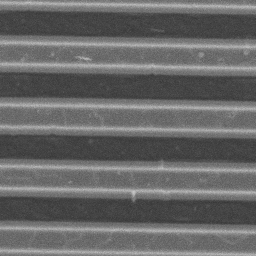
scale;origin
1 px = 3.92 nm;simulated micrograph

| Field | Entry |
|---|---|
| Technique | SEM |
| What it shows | parallel lines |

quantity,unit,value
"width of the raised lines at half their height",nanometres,112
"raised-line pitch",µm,0.243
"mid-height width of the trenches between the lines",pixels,33.5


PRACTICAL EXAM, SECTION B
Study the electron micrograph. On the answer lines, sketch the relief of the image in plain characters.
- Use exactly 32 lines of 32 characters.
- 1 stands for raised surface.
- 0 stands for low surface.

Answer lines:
11111111111111111111111111111111
00000000000000000000000000000000
00000000000000000000000000000000
00000000000000000000000000000000
00000000000000000000000000000000
11111111111111111111111111111110
11111111111111111111111111111111
11111111111111111111111111111111
00000100001111111111111111111111
00000000000000000000000000000000
00000000000000000000000000000000
00000000000000000000000000000000
00000000000000000000000000000000
11111111111111111111111111111111
11111111111111111111111111111111
11111111111111111111111111111111
00000000000000000001111111111111
00000000000000000000000000000000
00000000000000000000000000000000
00000000000000000000000000000000
11000000000000000000000000000000
11111111111111111111111111111111
11111111111111111111111111111111
11111111111111111111111111111111
00000000000000000000000000000000
00000000000000000000000000000000
00000000000000000000000000000000
00000000000000000000000000000000
11111111111111111111111000000000
11111111111111111111111111111111
11111111111111111111111111111111
11111111111111111111111111111111